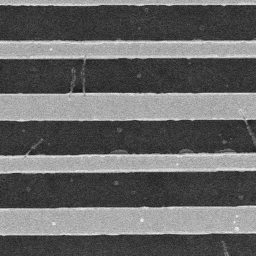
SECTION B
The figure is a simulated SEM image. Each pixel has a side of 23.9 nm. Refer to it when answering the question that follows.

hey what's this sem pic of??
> lines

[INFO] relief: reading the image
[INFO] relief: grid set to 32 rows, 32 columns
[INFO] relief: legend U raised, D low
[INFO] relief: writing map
UUUUUUUUUUUUUUUUUUUUUUUUUUUUUUUU
DDDDDDDDDDDDDDDDDDDDDDDDDDDDDDDD
DDDDDDDDDDDDDDDDDDDDDDDDDDDDDDDD
DDDDDDDDDDDDDDDDDDDDDDDDDDDDDDDD
DDDDDDDDDDDDDDDDDDDDDDDDDDDDDDDD
UUUUUUUUUUUUUUUUUUUUUUUUUUUUUUUU
UUUUUUUUUUUUUUUUUUUUUUUUUUUUUUUU
DDDDDDDDDDDDDDDDDDDDDDDDDDDDDDDD
DDDDDDDDDDDDDDDDDDDDDDDDDDDDDDDD
DDDDDDDDDDDDDDDDDDDDDDDDDDDDDDDD
DDDDDDDDDDDDDDDDDDDDDDDDDDDDDDDD
DDDDDDDDDDDDDDDDDDDDDDDDDDDDDDDD
UUUUUUUUUUUUUUUUUUUUUUUUUUUUUUUU
UUUUUUUUUUUUUUUUUUUUUUUUUUUUUUUU
UUUUUUUUUUUUUUUUUUUUUUUUUUUUUUUU
DDDDDDDDDDDDDDDDDDDDDDDDDDDDDDDD
DDDDDDDDDDDDDDDDDDDDDDDDDDDDDDDD
DDDDDDDDDDDDDDDDDDDDDDDDDDDDDDDD
DDDDDDDDDDDDDDDDDDDDDDDDDDDDDDDD
UDUUUUUUUUUUUUUUUUUUUUUUUUUUUUUU
UUUUUUUUUUUUUUUUUUUUUUUUUUUUUUUU
UUUUUUUUUUUUDDDDDDDDDDDDDDDDDDDD
DDDDDDDDDDDDDDDDDDDDDDDDDDDDDDDD
DDDDDDDDDDDDDDDDDDDDDDDDDDDDDDDD
DDDDDDDDDDDDDDDDDDDDDDDDDDDDDDDD
DDDDDDDDDDDDDDDDDDDDDDDDDDDDDDDD
UUUUUUUUUUUUUUUUUUUUUUUUUUUUUUUU
UUUUUUUUUUUUUUUUUUUUUUUUUUUUUUUU
UUUUUUUUUUUUUUUUUUUUUUUUUUUUUUUU
DDDDDDDDDDDDDDDDDDDDDDDDDDDDDDDD
DDDDDDDDDDDDDDDDDDDDDDDDDDDDDDDD
DDDDDDDDDDDDDDDDDDDDDDDDDDDDDDDD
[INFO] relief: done